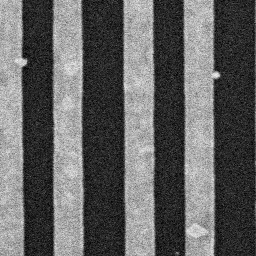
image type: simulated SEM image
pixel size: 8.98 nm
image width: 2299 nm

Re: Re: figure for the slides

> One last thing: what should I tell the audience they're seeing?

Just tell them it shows wiring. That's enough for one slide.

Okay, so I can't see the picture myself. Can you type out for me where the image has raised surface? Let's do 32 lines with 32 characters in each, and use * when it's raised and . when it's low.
***....***......***....****.....
***....***......***....****.....
***....***......***....****.....
***....***......***....****.....
***....***......***....****.....
***....***......***....****.....
***....***......***....****.....
***....***......***....****.....
***....***......***....****.....
***....***......***....****.....
***....***......***....****.....
***....***......***....****.....
***....***......***....****.....
***....***......***....****.....
***....***......***....****.....
***....***......***....****.....
***....***......***....****.....
***....***......***....****.....
***....***......***....****.....
***....***......***....****.....
***....***......***....****.....
***....***......***....****.....
***....***......***....****.....
***....***......***....****.....
***....***......***....****.....
***....***......***....****.....
***....***......***....****.....
***....***......***....****.....
***....***......***....****.....
***....***......***....****.....
***....***......***....****.....
***....***......***....****.....